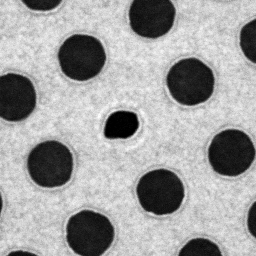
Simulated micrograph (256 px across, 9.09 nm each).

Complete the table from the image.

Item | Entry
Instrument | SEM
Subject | holes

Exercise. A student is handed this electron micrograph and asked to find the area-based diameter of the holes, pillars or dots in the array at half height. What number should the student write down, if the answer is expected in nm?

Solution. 431